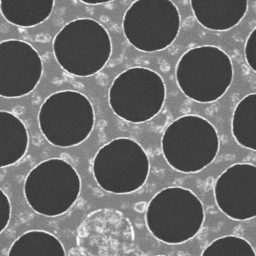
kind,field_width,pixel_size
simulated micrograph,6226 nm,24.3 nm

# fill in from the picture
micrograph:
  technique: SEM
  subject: a regular array of holes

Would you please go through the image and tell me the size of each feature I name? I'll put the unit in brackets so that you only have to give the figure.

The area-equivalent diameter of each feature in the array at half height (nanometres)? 1340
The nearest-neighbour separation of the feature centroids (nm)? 1730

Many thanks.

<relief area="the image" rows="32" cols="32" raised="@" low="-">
-------@@@@@@@@@@-----@@-------@
------@@@@@@@@@@------@@-------@
@----@@@@@-@@@@-------@@@-----@@
@@@@@@@@-----@@-------@@@@---@@@
@@@@@@@-------@@------@@@@@@@@@-
---@@@@-------@@@----@@@@@@@@@@-
-----@@-------@@@@@@@@@-----@@@-
-----@@------@@@@@@@@@@------@@-
-----@@@-----@@@@-@@@@-------@@@
-----@@@@@@@@@@-----@@-------@@@
-----@@@@@@@@@------@@-------@@@
----@@@@-@@@@@-------@@-----@@@@
@@@@@@-----@@@------@@@@---@@@--
@@@@@-------@@------@@@@@@@@@@--
--@@@-------@@@----@@@@-@@@@@---
---@@-------@@@@@@@@@-----@@@---
---@@------@@@@@@@@@@------@@---
---@@@----@@@@--@@@@-------@@@--
---@@@@@@@@@@-----@@-------@@@@-
---@@@@@@@@@------@@@------@@@@@
-@@@@----@@@-------@@-----@@@@@@
@@@@-----@@@------@@@@@@@@@@----
@@@-------@@------@@@@@@@@@-----
@@@-------@@@----@@@@-@@@@@-----
-@@-------@@@@@@@@@-----@@@-----
-@@@-----@@@@@@@@@@------@@-----
-@@@@---@@@@@@@@@@-------@@@----
-@@@@@@@@@@@@@@@@@-------@@@@@@@
-@@@@@@@@@@@@@@@@@@------@@@@@@@
@@@----@@@@@@@@@@@@-----@@@@@@@@
@@------@@@@@@@@@@@@@@@@@@-----@
@-------@@@@@@@@@@@@@@@@@@------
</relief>